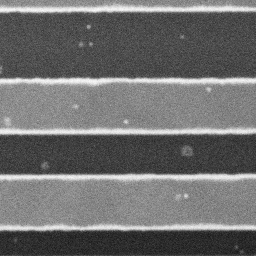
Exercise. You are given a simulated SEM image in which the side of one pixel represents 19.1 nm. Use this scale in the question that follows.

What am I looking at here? lines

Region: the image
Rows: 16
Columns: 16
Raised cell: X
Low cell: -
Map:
XXXXXXXXXXXXXXXX
----------------
----------------
----------------
----------------
XXXXXXXXXXXXXXXX
XXXXXXXXXXXXXXXX
XXXXXXXXXXXXXXXX
----------------
----------------
----------------
XXXXXXXXXXXXXXXX
XXXXXXXXXXXXXXXX
XXXXXXXXXXXXXXXX
----------------
----------------